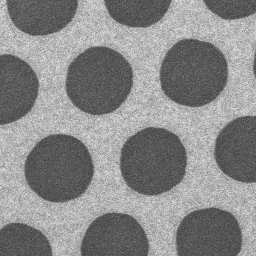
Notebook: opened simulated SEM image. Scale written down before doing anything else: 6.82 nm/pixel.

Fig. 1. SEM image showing holes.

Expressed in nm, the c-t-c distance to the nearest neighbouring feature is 646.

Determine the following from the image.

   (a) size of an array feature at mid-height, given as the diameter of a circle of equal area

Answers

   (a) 0.466 um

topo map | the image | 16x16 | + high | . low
.....++....++...
+...++++..++++++
+++++++++++.++++
.++++...++....++
..++....++....++
..++....++....++
..+++...+++..+++
.++++++++++++++.
+++.++++...+++..
++....++....+...
++....++....++..
++....++...+++++
+++.++++++++++++
++++++..++++...+
...++....++....+
...++....++....+